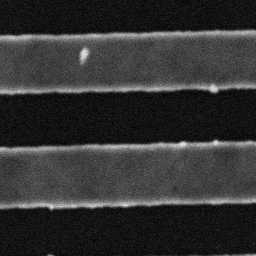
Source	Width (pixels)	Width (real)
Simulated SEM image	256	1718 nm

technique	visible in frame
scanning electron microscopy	lines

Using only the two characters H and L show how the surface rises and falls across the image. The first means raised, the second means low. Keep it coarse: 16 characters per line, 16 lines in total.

LLLLLLLLLLLLLLLL
LLLLLLLLLLLLLLLL
HHHHHHHHHHHHHHHH
HHHHHHHHHHHHHHHH
HHHHHHHHHHHHHHHH
HHHHHHHHHHHHHHHH
LLLLLLLLLLLLLLLL
LLLLLLLLLLLLLLLL
LLLLLLLLLLLLLLLL
HHHHHHHHHHHHHHHH
HHHHHHHHHHHHHHHH
HHHHHHHHHHHHHHHH
HHHHHHHHHHHHHHHH
LLLLLLLLLLLLLLLL
LLLLLLLLLLLLLLLL
LLLLLLLLLLLLLLLL